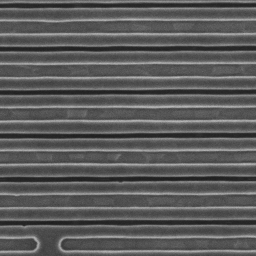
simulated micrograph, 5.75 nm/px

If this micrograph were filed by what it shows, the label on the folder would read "parallel lines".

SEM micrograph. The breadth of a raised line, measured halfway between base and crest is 70.4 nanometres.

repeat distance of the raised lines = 125 nm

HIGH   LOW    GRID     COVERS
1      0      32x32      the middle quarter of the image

00000000000000000000000000000000
00000000000000000000000000000000
00000000000000000000000000000000
11111111111111111111111111111111
11111111111111111111111111111111
11111111111111111111111111111111
00000000000000000000000000000000
00000000000000000000000000000000
11111111111111111111111111111111
11111111111111111111111111111111
11111111111111111111111111111111
00000000000000000000000000000000
00000000000000000000000000000000
00000000000000000000000000000000
11111111111111111111111111111111
11111111111111111111111111111111
11111111111111111111111111111111
00000000000000000000000000000000
00000000000000000000000000000000
11111111111111111111111111111111
11111111111111111111111111111111
11111111111111111111111111111111
00000000000000000000000000000000
00000000000000000000000000000000
00000000000000000000000000000000
11111111111111111111111111111111
11111111111111111111111111111111
11111111111111111111111111111111
00000000000000000000000000000000
00000000000000000000000011101111
11111111111111111111111111111111
11111111111111111111111111111111